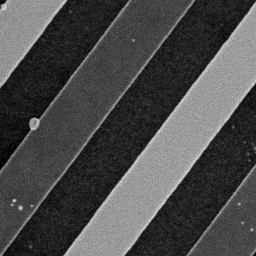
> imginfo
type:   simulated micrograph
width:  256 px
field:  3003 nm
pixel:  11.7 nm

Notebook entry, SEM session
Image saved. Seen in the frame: lines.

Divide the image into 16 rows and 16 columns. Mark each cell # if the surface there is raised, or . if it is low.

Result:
####....####....
###....####....#
##....####....##
##...#####...###
#....####....###
....####....####
...####....####.
..#####...####..
..####....###...
.####....####...
####....####....
###....####....#
###....###....##
##....####....##
#....####....###
....####....####